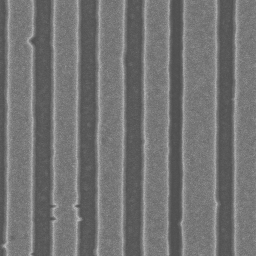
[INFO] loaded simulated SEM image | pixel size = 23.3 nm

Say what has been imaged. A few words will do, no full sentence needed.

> parallel lines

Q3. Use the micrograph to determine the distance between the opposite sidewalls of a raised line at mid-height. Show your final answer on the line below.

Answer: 629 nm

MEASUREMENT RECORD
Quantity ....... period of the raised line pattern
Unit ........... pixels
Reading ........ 44.9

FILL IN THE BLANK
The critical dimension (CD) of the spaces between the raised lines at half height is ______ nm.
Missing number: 420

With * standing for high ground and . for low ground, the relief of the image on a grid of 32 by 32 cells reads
.***...***..****..***..****..***
.***...***..****..***..****..***
.***...***..****..***..****..***
.***...***..****..***..****..***
.***...***..****..***..****..***
.***...***..****..***..****..***
.***...***..****..***..****..***
.***...***..***...***..****..***
.***...***..***...***..****..***
.***...***..****..***..****..***
.***...***..****..***..****..***
.***...***..****..***..****..***
.***...***..****..***..****..***
.***...***..****..***..****..***
.***...***..****..***..****..***
.***...***..****..***..****..***
.***...***..****..***..****..***
.***...***..****..***..****..***
.***...***..****..***..****..***
.***...***..****..***..****..***
.***...***..***...***..****..***
.***...***..***...***..****..***
.***...***..***...***..****..***
.***...***..***...***..****..***
.***...***..***...***..****..***
.***...***..***...***..****..***
.***...***..***...***..****..***
.***...***..***...***..****..***
.***...***..***...***..****..***
.***...***..****..***..****..***
.***...***..****..***..****..***
.***..****..***...***..****..***